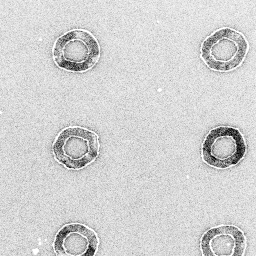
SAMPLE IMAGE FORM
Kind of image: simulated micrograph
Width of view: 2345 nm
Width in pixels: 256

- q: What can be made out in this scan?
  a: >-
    ring-shaped raised bodies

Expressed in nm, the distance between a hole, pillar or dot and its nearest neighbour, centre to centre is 889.